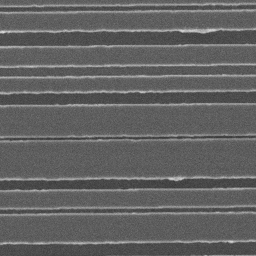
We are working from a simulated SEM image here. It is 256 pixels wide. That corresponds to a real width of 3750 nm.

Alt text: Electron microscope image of lines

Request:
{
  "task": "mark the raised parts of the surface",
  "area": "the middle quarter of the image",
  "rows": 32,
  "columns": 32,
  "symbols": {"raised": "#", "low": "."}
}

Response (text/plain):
########################........
................................
................................
################################
################################
################################
################################
................................
................................
................................
################################
################################
################################
################################
################################
################################
################################
################################
##..############################
################################
################################
################################
################################
################################
################################
################################
################################
################################
#########.##.#.####.#####.####..
................................
................................
.................###############